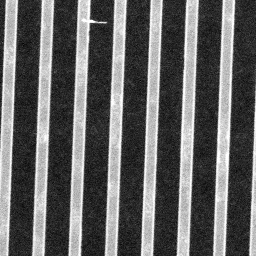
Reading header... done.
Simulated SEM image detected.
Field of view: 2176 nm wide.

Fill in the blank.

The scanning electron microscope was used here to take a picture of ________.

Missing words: parallel lines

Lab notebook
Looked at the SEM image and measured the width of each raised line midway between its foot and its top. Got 93.5 nm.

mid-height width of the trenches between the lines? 216 nanometers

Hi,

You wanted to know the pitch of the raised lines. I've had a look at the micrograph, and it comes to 308 nm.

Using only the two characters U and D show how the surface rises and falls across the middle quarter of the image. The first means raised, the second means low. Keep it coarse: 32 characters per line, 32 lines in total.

DDDUUUDDDDDDUUUDDDDDDUUUDDDDDDUU
DDDUUUDDDDDDUUUDDDDDDUUUDDDDDDUU
DDDUUUDDDDDDUUUDDDDDDUUUDDDDDDUU
DDDUUUDDDDDDUUUDDDDDDUUUDDDDDDUU
DDDUUUDDDDDDUUUDDDDDDUUUDDDDDDUU
DDDUUUDDDDDDUUUDDDDDDUUUDDDDDDUU
DDDUUDDDDDDDUUUDDDDDDUUUDDDDDDUU
DDDUUDDDDDDDUUUDDDDDDUUUDDDDDDUU
DDDUUDDDDDDDUUDDDDDDDUUUDDDDDDUU
DDDUUDDDDDDDUUDDDDDDDUUUDDDDDDUU
DDDUUDDDDDDDUUDDDDDDDUUUDDDDDDUU
DDDUUDDDDDDDUUDDDDDDDUUDDDDDDDUU
DDDUUDDDDDDDUUDDDDDDDUUDDDDDDDUU
DDDUUDDDDDDDUUDDDDDDDUUDDDDDDDUU
DDDUUDDDDDDDUUDDDDDDDUUDDDDDDDUU
DDDUUDDDDDDDUUDDDDDDDUUDDDDDDDUU
DDDUUDDDDDDDUUDDDDDDDUUDDDDDDDUU
DDDUUDDDDDDDUUDDDDDDDUUDDDDDDDUU
DDDUUDDDDDDDUUDDDDDDDUUDDDDDDDUU
DDUUUDDDDDDDUUDDDDDDDUUDDDDDDDUU
DDUUUDDDDDDDUUDDDDDDDUUDDDDDDUUU
DDUUUDDDDDDUUUDDDDDDDUUDDDDDDUUU
DDUUUDDDDDDUUUDDDDDDDUUDDDDDDUUU
DDUUUDDDDDDUUUDDDDDDUUUDDDDDDUUU
DDUUUDDDDDDUUUDDDDDDUUUDDDDDDUUU
DDUUUDDDDDDUUUDDDDDDUUUDDDDDDUUU
DDUUUDDDDDDUUUDDDDDDUUUDDDDDDUUU
DDUUUDDDDDDUUUDDDDDDUUUDDDDDDUUU
DDUUUDDDDDDUUUDDDDDDUUUDDDDDDUUU
DDUUUDDDDDDUUUDDDDDDUUUDDDDDDUUU
DDUUUDDDDDDUUUDDDDDDUUUDDDDDDUUU
DDUUUDDDDDDUUUDDDDDDUUUDDDDDDUUU